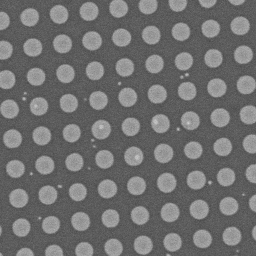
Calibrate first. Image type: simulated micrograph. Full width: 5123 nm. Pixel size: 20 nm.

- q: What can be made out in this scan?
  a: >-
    an array of small figures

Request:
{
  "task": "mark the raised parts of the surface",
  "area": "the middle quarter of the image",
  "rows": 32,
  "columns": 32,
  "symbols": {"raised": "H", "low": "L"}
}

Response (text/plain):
HLLLLLHHHHLLLHHHHLLLLHHHHLLLHHHH
HHLLLLHHHHLLLHHHHLLLLHHHLLLLLLLL
HHLLLLHHHHLLLLHHHLLLLLLLLLLLLLLL
HHLLLLHHHLLLLLLLLLLLLLLLLLLLLLLL
HLLLLLLLLLLLLLLLLLLLLLLLLLLLLLLL
LLLLLLLLLLLLLLLLLLLLLLHHLLLLLHHH
LLLLLLLLLLLLLLLHHLLLLHHHHLLLLHHH
LLLLLLLHHHLLLLHHHHLLLHHHHHLLLHHH
HHHLLLHHHHHLLLHHHHLLLHHHHLLLLHHH
HHHLLLHHHHHLLLHHHHLLLLHHLLLLLLLL
HHHLLLLHHHLLLLLHHLLLLLLLLLLLLLLL
HHHLLLLLLLLLLLLLLLLLLLLLLLLLLLLL
LLLLLLLLLLLLLLLLLLLLLLLLLLLLLLHH
LLLLLLLLLLLLLLLLLLLLLLHHHHLLLHHH
LLLLLLLLHHHLLLLHHHHLLLHHHHLLLHHH
LHHLLLLHHHHLLLLHHHHLLLHHHHLLLLHH
HHHHLLLHHHHHLLLHHHHLLLLHHHLLLLLL
HHHHLLLHHHHLLLLHHHLLLLLLLLLLLLLL
HHHHLLLLHHLLLLLLLLLLLLLLLLLLLLLL
LLLLLLLLLLLLLLLLLLLLLLLLLLLLLLLL
LLLLLLLLLLLLLLLLLLLLLLLHHHLLLLHH
LLLLLLLLLLLLLLLLHHHLLLLHHHHLLLHH
LLHLLLLLHHHHLLLHHHHHLLLHHHHLLLHH
LHHHLLLLHHHHLLLHHHHHLLLHHHHLLLLH
LHHHHLLLHHHHLLLLHHHLLLLLHHLLLLLL
LHHHHLLLLHHHLLLLLLLLLLLLLLLLLLLL
LLHHLLLLLLLLLLLLLLLLLLLLLLLLLLLL
LLLLLLLLLLLLLLLLLLLLLLLLLHHLLLLH
LLLLLLLLLLLLLLLLLHHLLLLLHHHHLLLH
LLLLLLLLLHHHLLLLHHHHLLLHHHHHLLLH
LLHHHLLLLHHHHLLLHHHHLLLLHHHHLLLH
LHHHHLLLLHHHHLLLHHHHLLLLHHHLLLLL